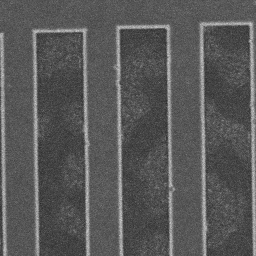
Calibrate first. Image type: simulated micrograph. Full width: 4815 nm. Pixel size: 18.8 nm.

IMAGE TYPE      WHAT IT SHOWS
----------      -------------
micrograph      one or a few lines or trenches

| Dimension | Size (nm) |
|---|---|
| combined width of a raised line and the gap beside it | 1570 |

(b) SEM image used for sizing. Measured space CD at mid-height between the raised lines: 940 nm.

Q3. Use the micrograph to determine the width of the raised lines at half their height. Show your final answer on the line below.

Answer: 621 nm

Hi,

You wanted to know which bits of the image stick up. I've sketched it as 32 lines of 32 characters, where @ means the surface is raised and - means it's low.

@@@@@@@@@@@@@@@@@@@@@@@@@@@@@@@@
@@@@@@@@@@@@@@@@@@@@@@@@@@@@@@@@
@@@@@@@@@@@@@@@@@@@@@@@@@@@@@@@@
@@@@@@@@@@@@@@@------@@@@------@
@@@@-------@@@@------@@@@------@
@@@@-------@@@@------@@@@------@
@@@@-------@@@@------@@@@-------
@@@@-------@@@@------@@@@-------
@@@@-------@@@@------@@@@-------
@@@@-------@@@@------@@@@-------
@@@@-------@@@@------@@@@-------
@@@@-------@@@@------@@@@-------
@@@@-------@@@@------@@@@------@
@@@@-------@@@@------@@@@-------
@@@@-------@@@@------@@@@-------
@@@@-------@@@@------@@@@-------
@@@@-------@@@@------@@@@-------
@@@@-------@@@@------@@@@-------
@@@@-------@@@@------@@@@-------
@@@@-------@@@@------@@@@-------
@@@@@------@@@@------@@@@-------
-@@@@------@@@@------@@@@-------
-@@@@------@@@@------@@@@-------
-@@@@------@@@@------@@@@-------
-@@@@------@@@@------@@@@-------
-@@@@------@@@@------@@@@-------
-@@@@------@@@@------@@@@-------
-@@@@------@@@@------@@@@-------
-@@@@------@@@@------@@@@-------
-@@@@------@@@@------@@@@-------
-@@@@------@@@@------@@@@@------
-@@@@------@@@@------@@@@@------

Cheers